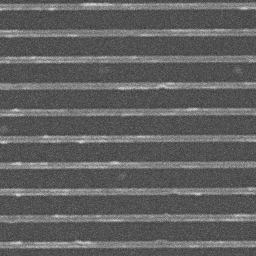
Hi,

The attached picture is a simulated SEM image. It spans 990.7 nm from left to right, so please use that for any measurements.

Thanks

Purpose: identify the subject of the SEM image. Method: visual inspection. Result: parallel lines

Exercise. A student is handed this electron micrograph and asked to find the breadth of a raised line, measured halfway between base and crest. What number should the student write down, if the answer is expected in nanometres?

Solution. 21.3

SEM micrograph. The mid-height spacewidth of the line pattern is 78.9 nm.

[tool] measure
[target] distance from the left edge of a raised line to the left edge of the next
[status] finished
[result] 102 nm